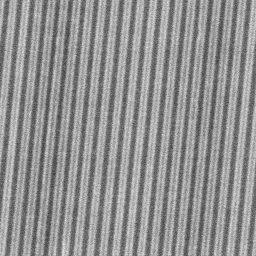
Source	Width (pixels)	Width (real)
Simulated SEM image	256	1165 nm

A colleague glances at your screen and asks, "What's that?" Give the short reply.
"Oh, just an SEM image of parallel lines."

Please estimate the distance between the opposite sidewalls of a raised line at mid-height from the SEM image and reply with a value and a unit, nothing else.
27.2 nanometres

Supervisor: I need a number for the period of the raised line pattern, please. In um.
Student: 0.0577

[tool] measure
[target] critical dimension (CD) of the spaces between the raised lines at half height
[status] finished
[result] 30.6 nanometers